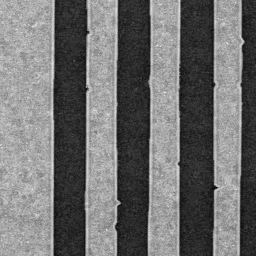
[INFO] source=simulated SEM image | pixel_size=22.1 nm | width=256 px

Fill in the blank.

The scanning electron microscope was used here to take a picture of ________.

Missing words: one or a few lines or trenches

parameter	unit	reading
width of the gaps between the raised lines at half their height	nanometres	780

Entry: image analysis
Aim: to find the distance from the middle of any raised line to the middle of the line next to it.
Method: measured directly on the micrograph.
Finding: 1380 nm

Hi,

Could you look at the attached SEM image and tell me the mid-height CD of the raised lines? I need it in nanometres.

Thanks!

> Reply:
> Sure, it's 598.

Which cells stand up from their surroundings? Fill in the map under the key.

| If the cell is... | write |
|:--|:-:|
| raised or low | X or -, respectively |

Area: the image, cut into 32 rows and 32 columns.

XXXXXXX----XXX-----XXX-----XXX--
XXXXXXX----XXX-----XXX-----XXX--
XXXXXXX----XXX-----XXX-----XXX--
XXXXXXX----XXX-----XXX-----XXX--
XXXXXXX----XXX-----XXX-----XXX--
XXXXXXX----XXX-----XXX-----XXX--
XXXXXXX----XXX-----XXX-----XXX--
XXXXXXX----XXX-----XXX-----XXX--
XXXXXXX----XXX-----XXX-----XXX--
XXXXXXX----XXX-----XXX-----XXX--
XXXXXXX----XXX-----XXX-----XXX--
XXXXXXX----XXX-----XXX-----XXX--
XXXXXXX----XXX-----XXX-----XXX--
XXXXXX-----XXX-----XXX-----XXX--
XXXXXX-----XXX-----XXX-----XXX--
XXXXXX-----XXX-----XXX-----XXX--
XXXXXX-----XXX-----XXX-----XXX--
XXXXXX-----XXX-----XXX-----XXX--
XXXXXX-----XXX-----XXX-----XXX--
XXXXXX-----XXX-----XXX-----XXX--
XXXXXX-----XXX-----XXX-----XXX--
XXXXXX-----XXX-----XXX-----XXX--
XXXXXX-----XXX-----XXX-----XXX--
XXXXXX-----XXX-----XXX-----XXX--
XXXXXX-----XXX-----XXX-----XXX--
XXXXXX-----XXXX----XXX-----XXX--
XXXXXX-----XXX-----XXX-----XXX--
XXXXXX-----XXX-----XXX-----XXX--
XXXXXX-----XXX-----XXX-----XXX--
XXXXXX-----XXX-----XXX-----XXX--
XXXXXX-----XXX-----XXX-----XXX--
XXXXXX-----XXX-----XXX-----XXX--